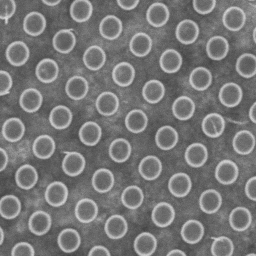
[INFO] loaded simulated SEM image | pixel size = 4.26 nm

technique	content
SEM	a regular array of raised bodies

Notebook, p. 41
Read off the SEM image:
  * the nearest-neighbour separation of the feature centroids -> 144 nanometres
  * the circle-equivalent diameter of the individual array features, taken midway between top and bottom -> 92.9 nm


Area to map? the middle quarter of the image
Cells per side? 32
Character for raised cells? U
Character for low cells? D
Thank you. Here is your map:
DDDDDDUUUDDDDUUUUDDDDDDDUUUUUDDD
DDDDDDDDDDDDDUUUUDDDDDDDDUUUDDDD
DDDDDDDDDDDDUUUUUDDDDDDDDDDDDDDD
DDUUDDDDDDDDUUUUUDDDDDDDDDDDDDDD
DUUUUDDDDDDDDUUUUDDDDUUUDDDDDDDD
DUUUUUDDDDDDDDDDDDDDUUUUUDDDDDDD
DUUUUUDDDDDDDDDDDDDDUUUUUDDDDDDD
DUUUUDDDDDUUDDDDDDDDUUUUUDDDDDDD
DDUUDDDDDUUUUDDDDDDDUUUUDDDDDUUD
DDDDDDDDUUUUUDDDDDDDDDUDDDDDUUUU
DDDDDDDDUUUUUDDDDDDDDDDDDDDUUUUU
UDDDDDDDDUUUUDDDDDDDDDDDDDDUUUUU
UUDDDDDDDDUUDDDDUUUUDDDDDDDDUUUU
UUDDDDDDDDDDDDDDUUUUDDDDDDDDDUUD
UDDDDDDDDDDDDDDUUUUUUDDDDDDDDDDD
UDDDDUUUDDDDDDDDUUUUDDDDDDDDDDDD
DDDDUUUUUDDDDDDDDUUUDDDDUUUDDDDD
DDDDUUUUUDDDDDDDDDDDDDDUUUUUDDDD
DDDDUUUUUDDDDDDDDDDDDDDUUUUUDDDD
DDDDDUUUDDDDDUUUDDDDDDDUUUUUDDDD
DDDDDDDDDDDDUUUUDDDDDDDDUUUDDDDD
DDDDDDDDDDDUUUUUDDDDDDDDDDDDDDDU
DUUDDDDDDDDDUUUUDDDDDDDDDDDDDDUU
UUUUUDDDDDDDUUUUDDDDDUUDDDDDDDDU
UUUUUDDDDDDDDDDDDDDUUUUUDDDDDDDU
UUUUUDDDDDDDDDDDDDDUUUUUDDDDDDDD
UUUUDDDDDUDDDDDDDDDUUUUUDDDDDDDD
DUUDDDDDUUUUDDDDDDDUUUUUDDDDDDDD
DDDDDDDUUUUUDDDDDDDDUUUDDDDUUUUD
DDDDDDDUUUUUDDDDDDDDDDDDDDUUUUUD
DDDDDDDDUUUUDDDDDDDDDDDDDDUUUUUU
UDDDDDDDUUUDDDDUUUUDDDDDDDDUUUUD